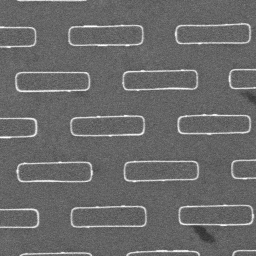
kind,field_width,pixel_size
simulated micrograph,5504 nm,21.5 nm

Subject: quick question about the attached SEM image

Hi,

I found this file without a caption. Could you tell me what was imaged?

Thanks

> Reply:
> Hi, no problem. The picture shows groups of lines, slits or small figures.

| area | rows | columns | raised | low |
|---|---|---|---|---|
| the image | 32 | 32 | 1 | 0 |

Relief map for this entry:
00000000000000000000000000000000
00000000000000000000000000000000
00000000000000000000000000000000
11110000011111111100001111111110
11110000011111111100001111111110
11110000011111111000000000000000
00000000000000000000000000000000
00000000000000000000000000000000
00000000000000000000000000000000
00111111111000011111111110000111
00111111111000011111111110000111
00000000000000000000000000000000
00000000000000000000000000000000
00000000000000000000000000000000
00000000000000000000000011111110
11110000011111111100001111111110
11110000011111111100000111111110
00000000000000000000000000000000
00000000000000000000000000000000
00000000000000000000000000000000
00011111111000001111111100000111
00111111111000001111111110000111
00011111111000001110000000000000
00000000000000000000000000000000
00000000000000000000000000000000
00000000000000000000000000000000
11111000011111111100001111111111
11111000011111111100001111111111
00000000000000000000000000000000
00000000000000000000000000000000
00000000000000000000000000000000
00000000000000000011111100000111